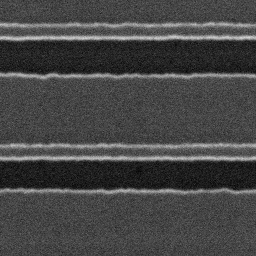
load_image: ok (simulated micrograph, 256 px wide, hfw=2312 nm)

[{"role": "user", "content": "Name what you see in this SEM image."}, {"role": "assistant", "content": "lines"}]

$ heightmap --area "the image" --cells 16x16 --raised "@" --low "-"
@@@@@@@@@@@@@@@@
@@@@@@@@@@@@@@@@
----------------
----------------
----------------
@@@@@@@@@@@@@@@@
@@@@@@@@@@@@@@@@
@@@@@@@@@@@@@@@@
@@@@@@@@@@@@@@@@
@@@@@@@@@@@@@@@@
----------------
----------------
@@@@@@@@@@@@@@@@
@@@@@@@@@@@@@@@@
@@@@@@@@@@@@@@@@
@@@@@@@@@@@@@@@@